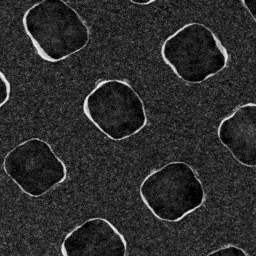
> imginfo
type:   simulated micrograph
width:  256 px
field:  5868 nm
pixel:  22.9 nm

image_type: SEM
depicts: holes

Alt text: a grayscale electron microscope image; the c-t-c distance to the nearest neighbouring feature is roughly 97.9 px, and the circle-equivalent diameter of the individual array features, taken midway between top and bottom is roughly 1280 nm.